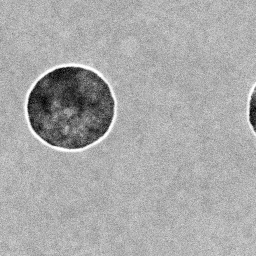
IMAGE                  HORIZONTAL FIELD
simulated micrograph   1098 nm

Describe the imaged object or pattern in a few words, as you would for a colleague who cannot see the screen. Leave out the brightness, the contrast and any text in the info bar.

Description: holes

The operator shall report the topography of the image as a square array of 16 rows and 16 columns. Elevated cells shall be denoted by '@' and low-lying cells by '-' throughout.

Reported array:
@@@@@@@@@@@@@@@@
@@@@@@@@@@@@@@@@
@@@@@@@@@@@@@@@@
@@@@@@@@@@@@@@@@
@@@---@@@@@@@@@@
@@-----@@@@@@@@@
@@-----@@@@@@@@@
@@-----@@@@@@@@@
@@----@@@@@@@@@@
@@@@@@@@@@@@@@@@
@@@@@@@@@@@@@@@@
@@@@@@@@@@@@@@@@
@@@@@@@@@@@@@@@@
@@@@@@@@@@@@@@@@
@@@@@@@@@@@@@@@@
@@@@@@@@@@@@@@@@